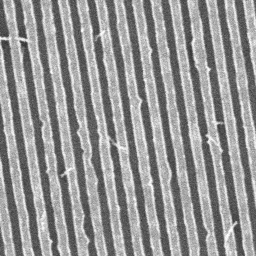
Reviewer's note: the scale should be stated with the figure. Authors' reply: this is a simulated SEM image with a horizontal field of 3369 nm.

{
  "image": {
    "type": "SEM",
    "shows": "parallel lines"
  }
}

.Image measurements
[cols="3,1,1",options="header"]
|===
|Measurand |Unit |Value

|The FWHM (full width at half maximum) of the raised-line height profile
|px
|8.89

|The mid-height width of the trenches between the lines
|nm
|117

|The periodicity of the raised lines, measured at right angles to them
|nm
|240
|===